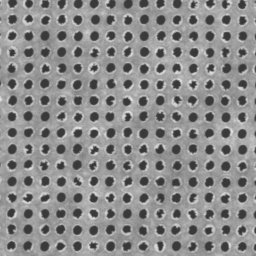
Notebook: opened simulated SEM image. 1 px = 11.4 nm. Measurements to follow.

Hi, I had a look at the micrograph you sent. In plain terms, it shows a regular array of holes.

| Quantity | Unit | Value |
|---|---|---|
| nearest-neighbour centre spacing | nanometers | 178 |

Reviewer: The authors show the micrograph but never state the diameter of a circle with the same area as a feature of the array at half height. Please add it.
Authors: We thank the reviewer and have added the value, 8.95 px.